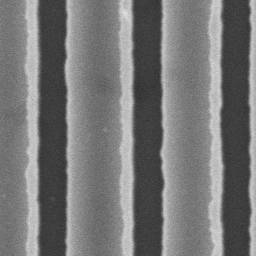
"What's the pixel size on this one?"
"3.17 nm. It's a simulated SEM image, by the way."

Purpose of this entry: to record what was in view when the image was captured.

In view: lines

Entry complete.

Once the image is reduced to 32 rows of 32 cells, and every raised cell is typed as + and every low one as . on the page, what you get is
+++++...++++++++....++++++++...+
++++....++++++++....++++++++...+
+++++...++++++++....++++++++...+
+++++...++++++++....++++++++...+
+++++...++++++++....++++++++...+
+++++...++++++++....++++++++...+
+++++...++++++++....++++++++...+
+++++...++++++++....++++++++...+
+++++...+++++++++...++++++++...+
+++++...++++++++....++++++++...+
+++++...++++++++....++++++++...+
+++++....+++++++....++++++++...+
+++++...+++++++++...++++++++...+
+++++...++++++++....++++++++...+
+++++...++++++++....+++++++....+
+++++...++++++++....+++++++....+
+++++....+++++++.....++++++....+
+++++....+++++++....++++++++...+
+++++...++++++++....++++++++...+
+++++...++++++++....++++++++...+
+++++....+++++++....++++++++...+
+++++...++++++++....++++++++...+
+++++....++++++++....+++++++...+
+++++....+++++++.....+++++++...+
+++++...++++++++....++++++++...+
+++++...++++++++....++++++++...+
+++++...++++++++....++++++++...+
+++++...+++++++++....+++++++...+
+++++...+++++++++...++++++++...+
+++++...++++++++....++++++++...+
+++++...+++++++++...++++++++...+
+++++...+++++++++...++++++++...+